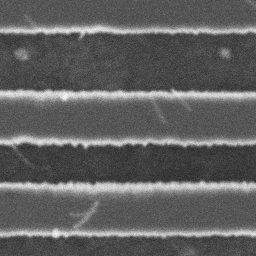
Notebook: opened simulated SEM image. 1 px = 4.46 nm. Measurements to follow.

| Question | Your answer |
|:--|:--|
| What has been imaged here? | lines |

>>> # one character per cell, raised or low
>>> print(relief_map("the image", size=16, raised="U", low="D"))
UUUUUUUUUUUUUUUU
UUUUUUUUUUUUUUUU
DDDDDDDDDDDDDDDD
DDDDDDDDDDDDDDDD
DDDDDDDDDDDDDDDD
DDDDDDDDDDDDDDDD
UUUUUUUUUUUUUUUU
UUUUUUUUUUUUUUUU
UUUUUUUUUUUUUUUU
DDDDDDDDDDDDDDDD
DDDDDDDDDDDDDDDD
UUUDUDUUUUUUUUUU
UUUUUUUUUUUUUUUU
UUUUUUUUUUUUUUUU
UUUUUUUUUUUUUUUU
DDDDDDDDDDDDDDDD